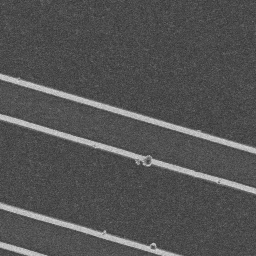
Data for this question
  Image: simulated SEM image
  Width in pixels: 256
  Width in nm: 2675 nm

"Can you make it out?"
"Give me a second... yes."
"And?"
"one or a few lines or trenches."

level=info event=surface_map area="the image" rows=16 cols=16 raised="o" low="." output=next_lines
oooooooooooooooo
oooooooooooooooo
oooooooooooooooo
oooooooooooooooo
oooooooooooooooo
..oooooooooooooo
......oooooooooo
o........ooooooo
oooo.........ooo
oooooooo........
ooooooooooo.....
ooooooooooooooo.
oooooooooooooooo
..oooooooooooooo
......oooooooooo
o........ooooooo